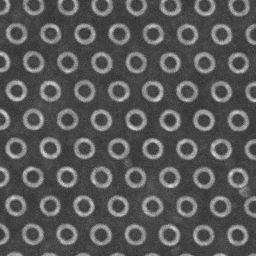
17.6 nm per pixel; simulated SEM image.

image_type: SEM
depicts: a regular array of ring-shaped raised bodies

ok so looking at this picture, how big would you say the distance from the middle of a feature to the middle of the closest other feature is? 33 pixels